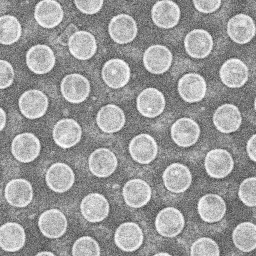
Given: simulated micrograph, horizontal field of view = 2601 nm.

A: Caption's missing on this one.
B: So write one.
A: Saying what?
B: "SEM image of a regular array of raised bodies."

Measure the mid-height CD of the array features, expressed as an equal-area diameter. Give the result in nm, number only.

281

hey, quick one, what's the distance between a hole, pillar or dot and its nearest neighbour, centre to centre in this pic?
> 0.445 µm